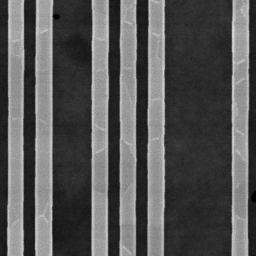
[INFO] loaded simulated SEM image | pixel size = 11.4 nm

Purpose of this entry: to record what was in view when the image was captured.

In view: wiring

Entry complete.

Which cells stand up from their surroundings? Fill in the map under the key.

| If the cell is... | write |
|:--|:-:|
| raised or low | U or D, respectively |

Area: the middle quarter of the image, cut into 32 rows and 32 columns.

DDDDDDDUUUUDDDUUUUDDDUUUUDDDDDDD
DDDDDDDUUUUDDDUUUUDDDUUUUDDDDDDD
DDDDDDDUUUUDDDUUUUDDDUUUUDDDDDDD
DDDDDDDUUUUDDDUUUUDDDUUUUDDDDDDD
DDDDDDDUUUUDDDUUUUDDDUUUUDDDDDDD
DDDDDDDUUUUDDDUUUUDDDUUUUDDDDDDD
DDDDDDDUUUUDDDUUUUDDDUUUUDDDDDDD
DDDDDDDUUUUDDDUUUUDDDUUUUDDDDDDD
DDDDDDDUUUUDDDUUUUDDDUUUUDDDDDDD
DDDDDDDUUUUDDDUUUUDDDUUUUDDDDDDD
DDDDDDDUUUUDDDUUUUDDDUUUUDDDDDDD
DDDDDDDUUUUDDDUUUUDDDUUUUDDDDDDD
DDDDDDDUUUUDDDUUUUDDDUUUUDDDDDDD
DDDDDDDUUUUDDDUUUUDDDUUUUDDDDDDD
DDDDDDDUUUUDDDUUUUDDDUUUUDDDDDDD
DDDDDDDUUUUDDDUUUUDDDUUUUDDDDDDD
DDDDDDDUUUUDDDUUUUDDDUUUUDDDDDDD
DDDDDDDUUUUDDDUUUUDDDUUUUDDDDDDD
DDDDDDDUUUUDDDUUUUDDDUUUUDDDDDDD
DDDDDDDUUUUDDDUUUUDDDUUUUDDDDDDD
DDDDDDDUUUUDDDUUUUDDDUUUUDDDDDDD
DDDDDDDUUUUDDDUUUUDDDUUUUDDDDDDD
DDDDDDDUUUUDDDUUUUDDDUUUUDDDDDDD
DDDDDDDUUUUDDDUUUUDDDUUUUDDDDDDD
DDDDDDDUUUUDDDUUUUDDDUUUUDDDDDDD
DDDDDDDUUUUDDDUUUUDDDUUUUDDDDDDD
DDDDDDDUUUUDDDUUUUDDDUUUUDDDDDDD
DDDDDDDUUUUDDDUUUUDDDUUUUDDDDDDD
DDDDDDDUUUUDDDUUUUDDDUUUUDDDDDDD
DDDDDDDUUUUDDDUUUUDDDUUUUDDDDDDD
DDDDDDDUUUUDDDUUUUDDDUUUUDDDDDDD
DDDDDDDUUUUDDDUUUUDDDUUUUDDDDDDD